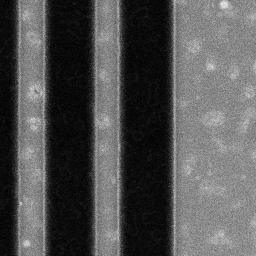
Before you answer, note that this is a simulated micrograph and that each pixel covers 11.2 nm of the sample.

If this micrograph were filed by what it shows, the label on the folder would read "one or a few lines or trenches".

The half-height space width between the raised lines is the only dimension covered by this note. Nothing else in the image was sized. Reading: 256 nanometres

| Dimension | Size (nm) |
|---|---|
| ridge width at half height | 616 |